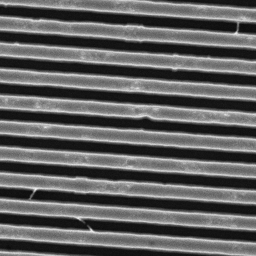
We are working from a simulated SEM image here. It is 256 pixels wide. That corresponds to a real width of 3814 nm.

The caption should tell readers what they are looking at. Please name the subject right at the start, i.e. parallel lines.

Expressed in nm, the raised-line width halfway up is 221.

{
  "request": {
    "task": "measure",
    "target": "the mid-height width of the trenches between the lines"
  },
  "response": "167 nm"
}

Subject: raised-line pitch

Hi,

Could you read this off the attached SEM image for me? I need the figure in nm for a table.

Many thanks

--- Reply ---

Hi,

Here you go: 386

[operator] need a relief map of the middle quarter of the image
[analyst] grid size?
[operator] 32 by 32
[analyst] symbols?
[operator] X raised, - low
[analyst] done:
-----------------XXXXXXXXXXXXXXX
-------------------------------X
XXX-----------------------------
XXXXXXXXXXXXXXXXX---------------
XXXXXXXXXXXXXXXXXXXXXXXXXXXXXXX-
XXXXXXXXXXXXXXXXXXXXXXXXXXXXXXXX
----------XXXXXXXXXXXXXXXXXXXXXX
------------------------XXXXXXXX
--------------------------------
XXXXXXXXXX----------------------
XXXXXXXXXXXXXXXXXXXXXXXXXX------
XXXXXXXXXXXXXXXXXXXXXXXXXXXXXXXX
---XXXXXXXXXXXXXXXXXXXXXXXXXXXXX
-----------------XX--XXXXXXXXXXX
-------------------------------X
XXXXX---------------------------
XXXXXXXXXXXXXXXXXXXX------------
XXXXXXXXXXXXXXXXXXXXXXXXXXXXXXXX
XXXXXXXXXXXXXXXXXXXXXXXXXXXXXXXX
---------XXXXXXXXXXXXXXXXXXXXXXX
------------------------XXXXXXXX
--------------------------------
XXXXXXXXXXXX--------------------
XXXXXXXXXXXXXXXXXXXXXXX---------
XXXXXXXXXXXXXXXXXXXXXXXXXXXXXXXX
--XX-XXXXXXXXXXXXXXXXXXXXXXXXXXX
----------------XXXXXXXXXXXXXXXX
------------------------------XX
XX-XXX--------------------------
XXXXXXXXXXXXXXXXXXX-------------
XXXXXXXXXXXXXXXXXXXXXXXXXXXXXXXX
XXXXXXXXXXXXXXXXXXXXXXXXXXXXXXXX